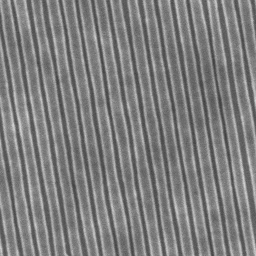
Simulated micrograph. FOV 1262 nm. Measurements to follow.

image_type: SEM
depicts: parallel lines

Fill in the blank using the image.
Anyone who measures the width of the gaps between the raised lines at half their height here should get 25.2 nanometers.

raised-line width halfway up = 50.5 nanometres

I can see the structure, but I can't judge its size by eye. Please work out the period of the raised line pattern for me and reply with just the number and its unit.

77.5 nm